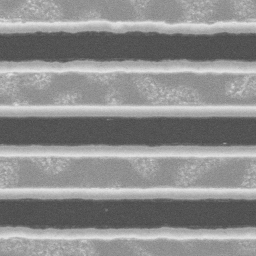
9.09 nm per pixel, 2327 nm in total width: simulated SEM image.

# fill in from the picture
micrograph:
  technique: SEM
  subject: one or a few lines or trenches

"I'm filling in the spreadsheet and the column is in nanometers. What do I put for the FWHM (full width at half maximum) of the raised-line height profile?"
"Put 400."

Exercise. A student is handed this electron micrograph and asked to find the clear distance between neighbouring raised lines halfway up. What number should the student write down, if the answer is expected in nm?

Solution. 353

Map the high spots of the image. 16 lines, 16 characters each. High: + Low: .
++++++++++++++++
++++++++++++++++
................
................
++++++++++++++++
++++++++++++++++
++++++++++++++++
................
................
++++++++++++++++
++++++++++++++++
++++++++++++++++
................
................
++..............
++++++++++++++++